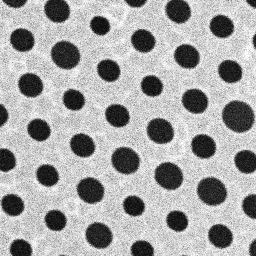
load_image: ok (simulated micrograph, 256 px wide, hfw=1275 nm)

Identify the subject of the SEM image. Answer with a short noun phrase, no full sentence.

a regular array of holes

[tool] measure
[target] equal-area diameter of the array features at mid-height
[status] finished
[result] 121 nanometers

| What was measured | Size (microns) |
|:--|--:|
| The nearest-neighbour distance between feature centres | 0.228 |